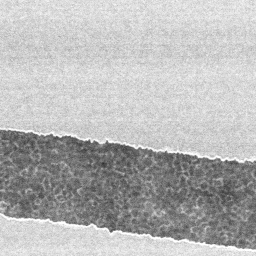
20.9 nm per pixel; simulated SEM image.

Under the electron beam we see one or a few lines or trenches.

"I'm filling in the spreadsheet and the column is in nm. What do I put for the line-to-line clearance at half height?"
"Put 1820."